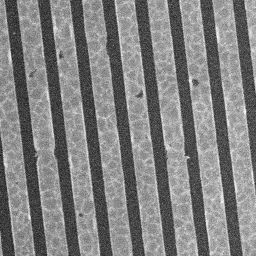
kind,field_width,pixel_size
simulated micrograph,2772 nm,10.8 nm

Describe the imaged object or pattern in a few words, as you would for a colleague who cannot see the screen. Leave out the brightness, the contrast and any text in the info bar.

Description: parallel lines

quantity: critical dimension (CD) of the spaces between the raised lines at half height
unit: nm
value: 140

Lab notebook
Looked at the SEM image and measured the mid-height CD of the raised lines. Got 0.207 µm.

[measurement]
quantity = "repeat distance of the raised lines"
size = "349 nm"